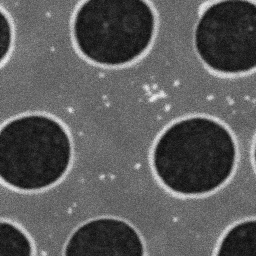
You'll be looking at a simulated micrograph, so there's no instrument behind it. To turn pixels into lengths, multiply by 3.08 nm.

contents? holes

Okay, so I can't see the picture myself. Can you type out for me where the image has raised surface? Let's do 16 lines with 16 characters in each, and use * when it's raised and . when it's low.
*****....****...
.****.....**....
.****....***....
*****....***....
**************.*
****************
****************
*..********..***
....******....**
....******.....*
....******.....*
*..*******....**
****************
****************
.****....*****..
..**.....*****..